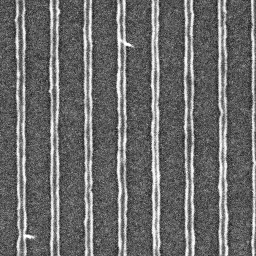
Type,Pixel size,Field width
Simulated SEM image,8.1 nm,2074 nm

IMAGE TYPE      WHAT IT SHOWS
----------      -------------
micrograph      parallel lines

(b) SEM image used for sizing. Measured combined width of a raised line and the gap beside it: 0.272 µm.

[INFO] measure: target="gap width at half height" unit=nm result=217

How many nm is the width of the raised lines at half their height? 55.7